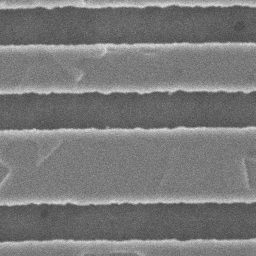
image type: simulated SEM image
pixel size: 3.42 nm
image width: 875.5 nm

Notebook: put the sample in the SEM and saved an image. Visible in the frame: lines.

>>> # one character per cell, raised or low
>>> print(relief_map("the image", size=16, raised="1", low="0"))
1000000000000000
0000000000000000
0000000000000000
1111111111111111
1111111111111111
1111111111111111
0000000000000000
0000000000000000
1111111111111111
1111111111111111
1111111111111111
1111111111111111
1111111111111111
0000000000000000
0000000000000000
1111111111111111